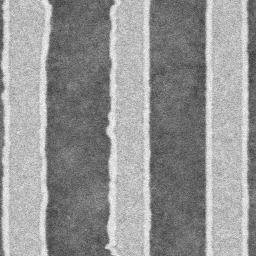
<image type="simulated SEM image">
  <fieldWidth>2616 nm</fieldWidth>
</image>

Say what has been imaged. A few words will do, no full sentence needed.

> one or a few lines or trenches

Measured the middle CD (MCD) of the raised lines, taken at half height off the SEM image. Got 0.37 µm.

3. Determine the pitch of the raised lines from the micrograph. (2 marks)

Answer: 1030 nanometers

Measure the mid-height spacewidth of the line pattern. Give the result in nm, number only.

650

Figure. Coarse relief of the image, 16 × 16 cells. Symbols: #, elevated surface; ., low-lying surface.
###....##....##.
###....##....##.
###....##....##.
###....##....##.
###....##....##.
###....##....##.
###....##....##.
###....##....##.
###....##....##.
###....##....##.
###....##....##.
###....##....##.
###....##....##.
###....##....##.
###....##....##.
###....##....##.